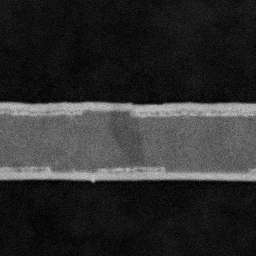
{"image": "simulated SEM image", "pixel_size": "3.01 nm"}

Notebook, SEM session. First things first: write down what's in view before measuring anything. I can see one or a few lines or trenches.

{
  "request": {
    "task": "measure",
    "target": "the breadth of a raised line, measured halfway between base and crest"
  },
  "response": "69.5 pixels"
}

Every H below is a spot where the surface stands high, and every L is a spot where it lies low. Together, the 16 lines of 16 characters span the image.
LLLLLLLLLLLLLLLL
LLLLLLLLLLLLLLLL
LLLLLLLLLLLLLLLL
LLLLLLLLLLLLLLLL
LLLLLLLLLLLLLLLL
LLLLLLLLLLLLLLLL
LLLLLLLLLLLLLLLL
HHHHHHHHHHHHHHHH
HHHHHHHHHHHHHHHH
HHHHHHHHHHHHHHHH
HHHHHHHHHHHHHHHH
LLLLLLLLLLLLLLLL
LLLLLLLLLLLLLLLL
LLLLLLLLLLLLLLLL
LLLLLLLLLLLLLLLL
LLLLLLLLLLLLLLLL